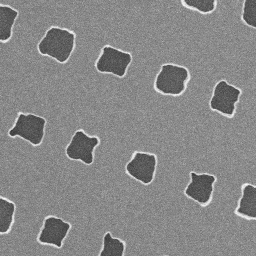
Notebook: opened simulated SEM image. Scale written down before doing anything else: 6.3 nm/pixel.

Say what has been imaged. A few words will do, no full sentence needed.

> a regular array of holes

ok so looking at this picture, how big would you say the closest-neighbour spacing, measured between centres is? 370 nm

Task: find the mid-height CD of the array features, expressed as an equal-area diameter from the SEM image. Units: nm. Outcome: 184